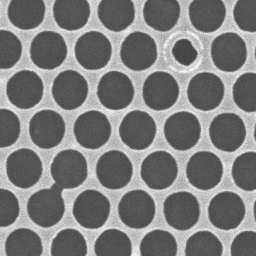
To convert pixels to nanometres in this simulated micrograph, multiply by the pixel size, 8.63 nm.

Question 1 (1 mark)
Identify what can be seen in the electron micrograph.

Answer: a regular array of holes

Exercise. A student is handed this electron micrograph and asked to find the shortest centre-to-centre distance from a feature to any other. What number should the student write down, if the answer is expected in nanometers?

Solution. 388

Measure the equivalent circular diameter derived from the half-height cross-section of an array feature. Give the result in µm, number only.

0.334